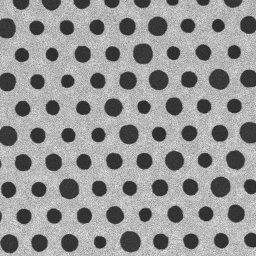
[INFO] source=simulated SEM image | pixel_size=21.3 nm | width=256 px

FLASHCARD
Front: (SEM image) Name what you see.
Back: a regular array of holes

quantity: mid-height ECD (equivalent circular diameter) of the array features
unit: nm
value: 337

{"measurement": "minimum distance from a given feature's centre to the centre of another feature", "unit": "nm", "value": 642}